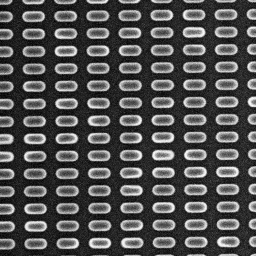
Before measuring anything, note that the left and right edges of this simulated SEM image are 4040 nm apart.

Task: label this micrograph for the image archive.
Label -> groups of lines, slits or small figures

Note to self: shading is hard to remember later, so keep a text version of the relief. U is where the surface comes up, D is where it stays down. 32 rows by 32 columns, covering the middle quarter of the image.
UUUDDDUUUUUDDDUUUUUDDDUUUUUDDDUU
UUUDDDUUUUUDDDUUUUUDDDUUUUUDDDUU
DDDDDDDDDDDDDDDDDDDDDDDDDDDDDDDD
DDDDDDDDDDDDDDDDDDDDDDDDDDDDDDDD
UUUDDDUUUUUDDDUUUUUDDDUUUUUDDDUU
UUUDDDUUUUUDDDUUUUUDDDUUUUUDDDUU
UUUDDDDUUUUDDDDDDDDDDDDDDDDDDDDD
DDDDDDDDDDDDDDDDDDDDDDDDDDDDDDDD
DDDDDDDDDDDDDDDDDDDDDDDDDDDDDDDD
UUUDDDUUUUUDDDUUUUUDDDUUUUUDDDUU
UUUDDDUUUUUDDDUUUUUDDDUUUUUDDDUU
DDDDDDDDDDDDDDDDDDDDDDDDDDDDDDDD
DDDDDDDDDDDDDDDDDDDDDDDDDDDDDDDD
UUUDDDDUUUUDDDUUUUUDDDUUUUUDDDUU
UUUDDDUUUUUDDDUUUUUDDDUUUUUDDDUU
DDDDDDDDDDDDDDDDDDDDDDDDDDDDDDDD
DDDDDDDDDDDDDDDDDDDDDDDDDDDDDDDD
DDDDDDDDUUUDDDUUUUUDDDDUUUUDDDUU
UUUDDDUUUUUDDDUUUUUDDDUUUUUDDDUU
UUDDDDDUUUUDDDDUUUDDDDDDDDDDDDDD
DDDDDDDDDDDDDDDDDDDDDDDDDDDDDDDD
DDDDDDDDDDDDDDDDDDDDDDDDDDDDDDDD
UUUDDDUUUUUDDDUUUUUDDDUUUUUDDDUU
UUUDDDUUUUUDDDUUUUUDDDDUUUUDDDDU
DDDDDDDDDDDDDDDDDDDDDDDDDDDDDDDD
DDDDDDDDDDDDDDDDDDDDDDDDDDDDDDDD
UUUDDDDUUUUDDDUUUUUDDDDUUUUDDDUU
UUUDDDUUUUUDDDUUUUUDDDUUUUUDDDUU
DDDDDDDDDDDDDDDDDDDDDDDDDDDDDDDD
DDDDDDDDDDDDDDDDDDDDDDDDDDDDDDDD
DDDDDDDDDDDDDDDDDDDDDDDUUUUDDDDU
UUUDDDUUUUUUDDUUUUUDDDUUUUUDDDUU